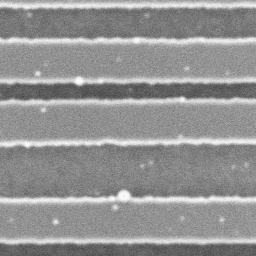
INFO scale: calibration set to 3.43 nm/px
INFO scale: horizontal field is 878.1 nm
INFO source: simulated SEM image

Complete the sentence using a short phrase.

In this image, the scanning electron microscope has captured lines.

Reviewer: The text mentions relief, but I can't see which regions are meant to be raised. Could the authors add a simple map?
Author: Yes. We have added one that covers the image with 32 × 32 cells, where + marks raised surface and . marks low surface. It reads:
++++++++++++++++++++++++++++++++
................................
................................
................................
................................
++++++++++++++++++++++++++++++++
++++++++++++++++++++++++++++++++
++++++++++++++++++++++++++++++++
++++++++++++++++++++++++++++++++
++++++++++++++++++++++++++++++++
................................
................................
................+.++++++++++.+++
++++++++++++++++++++++++++++++++
++++++++++++++++++++++++++++++++
++++++++++++++++++++++++++++++++
++++++++++++++++++++++++++++++++
++++++++++++++++++++++++++++++++
................................
................................
................................
................................
................................
................................
...............+................
++++++++++++++++++++++++++++++++
++++++++++++++++++++++++++++++++
++++++++++++++++++++++++++++++++
++++++++++++++++++++++++++++++++
++++++++++++++++++++++++++++++++
................................
................................